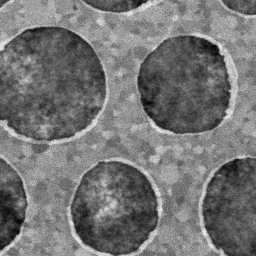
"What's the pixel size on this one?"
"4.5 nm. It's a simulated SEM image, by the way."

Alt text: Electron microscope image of holes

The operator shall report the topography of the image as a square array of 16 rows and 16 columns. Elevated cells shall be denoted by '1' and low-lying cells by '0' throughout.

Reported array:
1111110001111100
1111111111111111
1000011111000111
0000001110000011
0000000110000011
0000000110000011
0000001110000011
0000001110000011
1000111111111111
1111111111111111
0111110001111100
0111100001111000
0011100000111000
0011000000111000
0111100000111000
1111110001111100